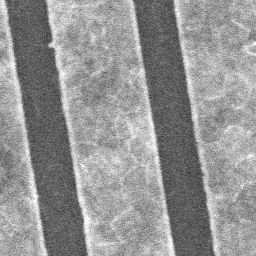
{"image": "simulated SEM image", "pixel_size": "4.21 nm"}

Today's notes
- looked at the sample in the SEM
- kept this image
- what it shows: one or a few lines or trenches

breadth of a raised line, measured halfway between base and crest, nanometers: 340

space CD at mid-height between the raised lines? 45.1 pixels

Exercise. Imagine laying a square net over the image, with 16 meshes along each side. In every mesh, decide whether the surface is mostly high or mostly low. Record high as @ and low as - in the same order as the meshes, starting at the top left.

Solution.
---@@@@@---@@@@@
---@@@@@---@@@@@
@--@@@@@@--@@@@@
@---@@@@@---@@@@
@---@@@@@---@@@@
@---@@@@@---@@@@
@---@@@@@---@@@@
@---@@@@@---@@@@
@@--@@@@@@--@@@@
@@---@@@@@---@@@
@@---@@@@@---@@@
@@---@@@@@---@@@
@@---@@@@@---@@@
@@---@@@@@---@@@
@@@--@@@@@@--@@@
@@@---@@@@@---@@